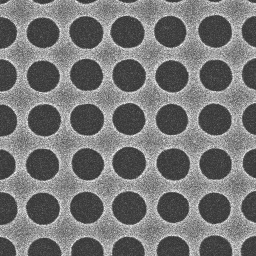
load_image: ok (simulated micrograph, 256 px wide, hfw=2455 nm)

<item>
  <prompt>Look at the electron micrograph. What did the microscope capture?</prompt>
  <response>a regular array of holes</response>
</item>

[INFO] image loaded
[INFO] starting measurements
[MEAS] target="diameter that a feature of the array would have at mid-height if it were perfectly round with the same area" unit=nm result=317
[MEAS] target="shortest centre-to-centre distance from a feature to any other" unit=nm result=407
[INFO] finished